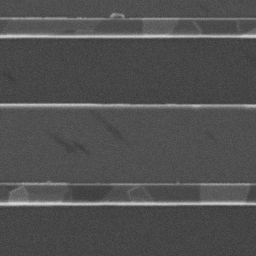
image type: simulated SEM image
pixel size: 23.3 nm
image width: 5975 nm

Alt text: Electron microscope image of lines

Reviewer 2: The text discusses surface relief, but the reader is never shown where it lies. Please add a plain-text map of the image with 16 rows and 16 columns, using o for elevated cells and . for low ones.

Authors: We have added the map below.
oooooooooooooooo
oooooooooooooooo
................
................
................
................
................
oooooooooooooooo
oooooooooooooooo
oooooooooooooooo
oooooooooooooooo
oooooooooooooooo
oooooooooooooooo
................
................
................